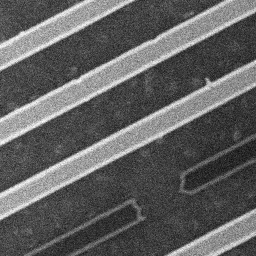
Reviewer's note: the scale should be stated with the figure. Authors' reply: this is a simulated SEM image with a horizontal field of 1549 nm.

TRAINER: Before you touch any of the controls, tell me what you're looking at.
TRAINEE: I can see one or a few lines or trenches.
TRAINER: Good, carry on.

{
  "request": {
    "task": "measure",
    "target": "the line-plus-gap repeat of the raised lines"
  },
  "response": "0.4 microns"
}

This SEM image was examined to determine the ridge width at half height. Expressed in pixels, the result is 20.9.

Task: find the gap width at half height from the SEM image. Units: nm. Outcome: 276